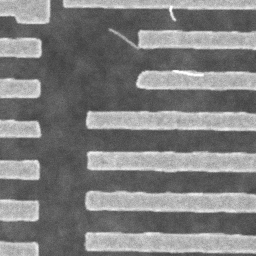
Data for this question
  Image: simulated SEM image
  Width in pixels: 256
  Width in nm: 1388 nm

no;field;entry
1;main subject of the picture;wiring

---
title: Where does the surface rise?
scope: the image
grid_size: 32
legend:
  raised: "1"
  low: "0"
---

11111100111111111111111111111111
11111100000000000000000000000000
00011100000000000000000000000000
00000000000000000000000000000000
00000000000000000011111111111111
11111000000000000011111111111111
11111000000000000000000000000000
00000000000000000000000000000000
00000000000000000000000000000000
00000000000000000011111111111111
11111000000000000111111111111111
11111000000000000000000000000000
00000000000000000000000000000000
00000000000000000000000000000000
00000000000111111111111111111111
11110000000111111111111111111111
11111000000000000000000000000000
00000000000000000000000000000000
00000000000000000000000000000000
00000000000111111111111111111111
11111000000111111111111111111111
11111000000000000000000000000000
00000000000000000000000000000000
00000000000000000000000000000000
00000000000111111111111111111111
11110000000111111111111111111111
11111000000000000000000000000000
00000000000000000000000000000000
00000000000000000000000000000000
00000000000111111111111111111000
10000000000111111111111111111111
11111000000000000000000000000000